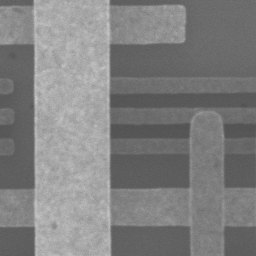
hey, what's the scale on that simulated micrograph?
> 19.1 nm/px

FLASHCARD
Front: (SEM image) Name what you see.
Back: wiring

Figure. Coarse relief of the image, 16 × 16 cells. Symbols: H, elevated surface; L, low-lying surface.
LLHHHHHLLLLLLLLL
LLHHHHHLLLLLLLLL
LLHHHHHLLLLLLLLL
LLHHHHHLLLLLLLLL
LLHHHHHLLLLLLLLL
LLHHHHHLLLLLLLLL
LLHHHHHLLLLLLLLL
LLHHHHHLLLLLHHLL
LLHHHHHLLLLLHHLL
LLHHHHHLLLLLHHLL
LLHHHHHLLLLLHHLL
LLHHHHHLLLLLHHLL
LLHHHHHLLLLLHHLL
LLHHHHHLLLLLHHLL
LLHHHHHLLLLLHHLL
LLHHHHHLLLLLHHLL